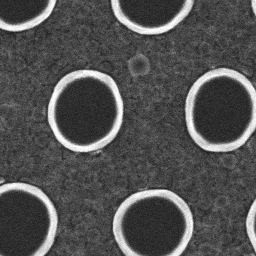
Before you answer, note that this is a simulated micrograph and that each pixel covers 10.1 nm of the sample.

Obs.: raised bodies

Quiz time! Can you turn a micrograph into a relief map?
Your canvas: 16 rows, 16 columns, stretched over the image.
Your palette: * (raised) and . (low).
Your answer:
***....*****....
**......***.....
................
................
................
....***.....****
...****.....****
...****.....****
....***.....***.
................
................
................
***.....***.....
***....*****....
***....*****....
***.....***.....